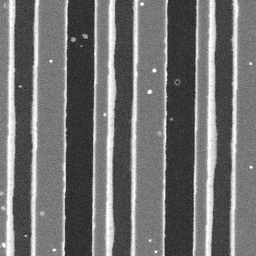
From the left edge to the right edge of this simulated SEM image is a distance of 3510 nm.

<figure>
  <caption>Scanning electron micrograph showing lines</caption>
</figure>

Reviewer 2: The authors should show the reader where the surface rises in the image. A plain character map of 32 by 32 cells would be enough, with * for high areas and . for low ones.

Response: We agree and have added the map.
**...***....**...****....**...**
**...***....**...****....**...**
*....***....**...****....**...**
*....***....**...****....**..***
*....***....**...****....**..***
*....***....**...****....**..***
*....***....**...****....**..***
*....***....**...****....**..***
*....***....**...****....**..***
*....***....**...****....**..***
*...****....**...****....**..***
*...****....**...****....**..***
*...****....**...****....**..***
*...****....**...****....**..***
*...****....**...****...***..***
*...****....**...****...***..***
*...****....**...****...***..***
*...****....**...****...***..***
*...****....**...****...***..***
*...****....**...****...***..***
*...****....**...****...***..***
*...****....**...****...**...***
*...****....**...****...**...***
*...****....**...****...**...***
*...****....**...****...**...***
*...****....**...***....**...***
*...****....**...****...**...***
*...****....**...***....**...***
*...****....**...***....**...***
*...****....**...***....**...***
*...****....**...***....**...***
*...****....**...***....**...***